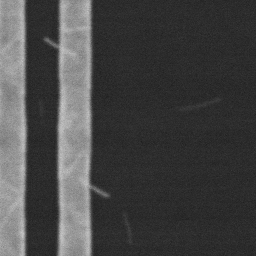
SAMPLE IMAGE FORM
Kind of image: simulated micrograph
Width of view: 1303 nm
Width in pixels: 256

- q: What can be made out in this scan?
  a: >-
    wiring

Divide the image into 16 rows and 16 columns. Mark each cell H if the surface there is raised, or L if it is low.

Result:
HLLLHHLLLLLLLLLL
HLLLHHLLLLLLLLLL
HLLLHHLLLLLLLLLL
HHLLHHLLLLLLLLLL
HHLLHHLLLLLLLLLL
HLLLHHLLLLLLLLLL
HHLLHHLLLLLLLLLL
HHLLHHLLLLLLLLLL
HHLLHHLLLLLLLLLL
HHLLHHLLLLLLLLLL
HHLLHHLLLLLLLLLL
HHLLHHLLLLLLLLLL
HLLLHHLLLLLLLLLL
HLLLHHLLLLLLLLLL
HLLLHHLLLLLLLLLL
HLLLHHLLLLLLLLLL